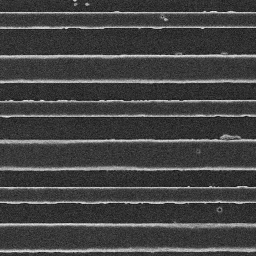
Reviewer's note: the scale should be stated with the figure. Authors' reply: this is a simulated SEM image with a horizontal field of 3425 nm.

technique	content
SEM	lines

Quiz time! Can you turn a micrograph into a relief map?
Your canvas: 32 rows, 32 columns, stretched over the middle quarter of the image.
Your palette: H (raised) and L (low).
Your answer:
HHHHHHHHHHHHHHHHHHHHHHHHHHHHHHHH
HHHHHHHHHHHHHHHHHHHHHHHHHHHHHHHH
HHHHHHHHHHHHHHHHHHHHHHHHHHHHHHHH
HHHHHHHHHHHHHHHHHHHHHHHHHHHHHHHH
LLLLLLLLLLLLLLLLLLLLLLLLHLLLHHHL
LLLLLLLLLLLLLLLLLLLLLLLLLLLLLLLL
LLLLLLLLLLLLLLLLLLLLLLLLLLLLLLLL
LLLLLLLLLLLLLLLLLLLLLLLLLLLLLLLL
LLLLLLLLLLLLLLLLLLLLLLLLLLLLLLLL
HHHHHHHHHHHHHHHHHHHHHHHHHHHHHHHH
HHHHHHHHHHHHHHHHHHHHHHHHHHHHHHHH
HHHHHHHHHHHHHHHHHHHHHHHHHHHHHHHH
HHHHHHHHHHHHHHHHHHHHHHHHHHHHHHHH
LLLLLLLLLLLLLLLLLLLLLLLLLLLLLLLL
LLLLLLLLLLLLLLLLLLLLLLLLLLLLLLLL
LLLLLLLLLLLLLLLLLLLLLLLLLLLLLLLL
LLLLLLLLLLLLLLLLLLLLLLLLLLLLLLLL
LLLLLLLLLLLLLLLLLLLLLLLLLLLLLLLL
LLLLLLLLLLLLLLLLLLLLLLLLLLLLLLLL
HHHHHHHHHHHHHHHHHHHHHHHHHHHHHHHH
HHHHHHHHHHHHHHHHHHHHHHHHHHHHHHHH
HHHHHHHHHHHHHHHHHHHHHHHHHHHHHHHH
HHHHHHHHHHHHHHHHHHHHHHHHHHHHHHHH
HHHHHHHHHHHHHHHHHHHHHHHHHHHHHHHH
HHHHHHHHHHHHHHHHHHHHHHHHHHHHHHHH
HHHHHHHHHHHHHHHHHHHHHHHHHHHHHHHH
LLLLLLLLLLLLLLLLLLLLLLLLLLLLLLLL
LLLLLLLLLLLLLLLLLLLLLLLLLLLLLLLL
LLLLLLLLLLLLLLLLLLLLLLLLLLLLLLLL
LLLLLLLLLLLLLLLLLLLLLLLLLLLLLLLL
LLLLLLLLLLLLLLLLLLLLLLLLLLLLLLLL
HHHHHHHHHHHHHHHHHHHHHHHHHHHHHHHH